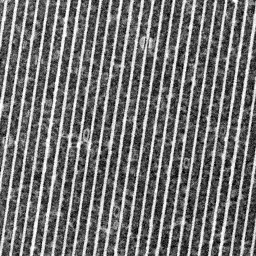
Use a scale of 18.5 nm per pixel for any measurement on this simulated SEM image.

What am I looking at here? parallel lines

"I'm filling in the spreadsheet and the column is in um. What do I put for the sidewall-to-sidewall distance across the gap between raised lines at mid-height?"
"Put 0.153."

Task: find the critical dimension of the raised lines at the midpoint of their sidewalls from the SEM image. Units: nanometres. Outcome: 36.7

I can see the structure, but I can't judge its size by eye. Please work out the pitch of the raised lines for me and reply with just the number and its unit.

192 nanometers